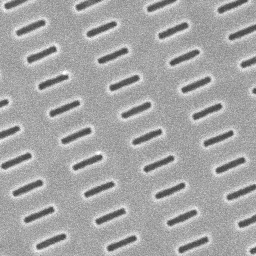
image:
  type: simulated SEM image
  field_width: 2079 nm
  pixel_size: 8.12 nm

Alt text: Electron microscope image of a regular array of holes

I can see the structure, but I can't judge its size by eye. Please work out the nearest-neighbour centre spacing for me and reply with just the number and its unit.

237 nanometres